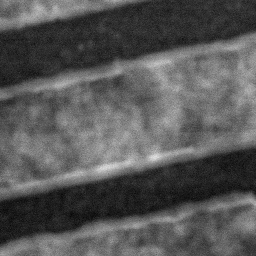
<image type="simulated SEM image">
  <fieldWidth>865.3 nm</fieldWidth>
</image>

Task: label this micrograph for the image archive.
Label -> one or a few lines or trenches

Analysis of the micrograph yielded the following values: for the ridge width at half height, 349 nanometers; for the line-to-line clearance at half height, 173 nm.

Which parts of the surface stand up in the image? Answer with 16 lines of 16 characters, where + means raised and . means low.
++++++..........
+...............
...............+
..........++++++
......++++++++++
.+++++++++++++++
++++++++++++++++
++++++++++++++++
++++++++++++++++
+++++++++++++...
++++++++........
++++............
..............++
..........++++++
.....+++++++++++
++++++++++++++++